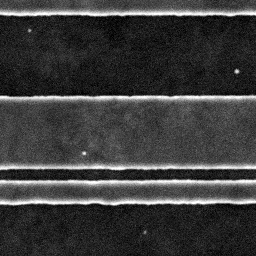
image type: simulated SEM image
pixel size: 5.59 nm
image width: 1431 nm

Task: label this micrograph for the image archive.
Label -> lines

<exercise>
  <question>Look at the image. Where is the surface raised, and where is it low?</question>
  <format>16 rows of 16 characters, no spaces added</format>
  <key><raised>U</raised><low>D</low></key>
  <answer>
UUUUUUUUUUUUUUUU
DDDDDDDDDDDDDDDD
DDDDDDDDDDDDDDDD
DDDDDDDDDDDDDDDD
DDDDDDDDDDDDDDDD
DDDDDDDDDDDDDDDD
UUUUUUUUUUUUUUUU
UUUUUUUUUUUUUUUU
UUUUUUUUUUUUUUUU
UUUUUUUUUUUUUUUU
UUUUUUUUUUUUUUUU
UUUUUUUUUUUUUUUU
UUUUUUUUUUUUUUUU
DDDDDDDDDDDDDDDD
DDDDDDDDDDDDDDDD
DDDDDDDDDDDDDDDD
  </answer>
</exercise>